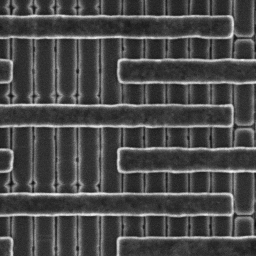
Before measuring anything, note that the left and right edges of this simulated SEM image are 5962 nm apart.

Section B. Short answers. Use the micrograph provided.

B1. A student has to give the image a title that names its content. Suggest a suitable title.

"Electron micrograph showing wiring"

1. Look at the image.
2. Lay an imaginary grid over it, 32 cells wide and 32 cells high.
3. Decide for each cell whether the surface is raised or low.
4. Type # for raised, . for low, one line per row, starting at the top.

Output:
................................
................................
#############################...
#############################...
#############################...
................................
................................
....................###....##...
#..............#################
#..............#################
................................
................................
................................
#############################...
#############################...
#############################...
................................
................................
...............#...####..#...##.
##.............#################
##.............#################
...............##.....#.........
................................
................................
#############################...
#############################...
#############################...
................................
................................
................................
##.............#################
#..............#################